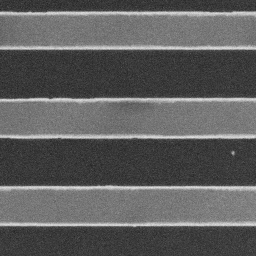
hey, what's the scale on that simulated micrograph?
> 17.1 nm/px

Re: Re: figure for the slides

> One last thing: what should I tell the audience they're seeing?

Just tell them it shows lines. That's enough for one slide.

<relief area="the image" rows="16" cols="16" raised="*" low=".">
................
****************
****************
................
................
................
****************
****************
****************
................
................
................
****************
****************
................
................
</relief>